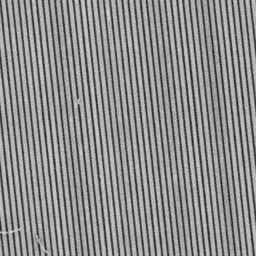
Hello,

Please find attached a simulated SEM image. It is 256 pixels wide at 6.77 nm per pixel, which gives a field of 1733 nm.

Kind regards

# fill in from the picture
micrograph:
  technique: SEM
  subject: parallel lines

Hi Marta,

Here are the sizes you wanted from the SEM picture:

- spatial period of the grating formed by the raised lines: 6.07 px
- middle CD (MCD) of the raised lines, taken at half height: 24.4 nanometres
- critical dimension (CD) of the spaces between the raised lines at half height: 12.6 nm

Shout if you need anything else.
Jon